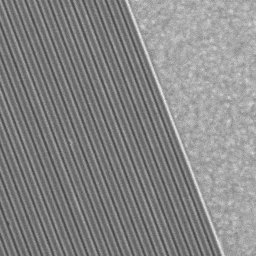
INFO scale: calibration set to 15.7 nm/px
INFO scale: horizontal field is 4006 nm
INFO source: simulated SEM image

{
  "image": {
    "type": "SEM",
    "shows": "parallel lines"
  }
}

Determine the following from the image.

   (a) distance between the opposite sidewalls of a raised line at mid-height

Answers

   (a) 115 nanometres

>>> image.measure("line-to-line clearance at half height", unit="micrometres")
0.0568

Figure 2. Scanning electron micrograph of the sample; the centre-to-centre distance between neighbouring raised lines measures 168 nanometres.